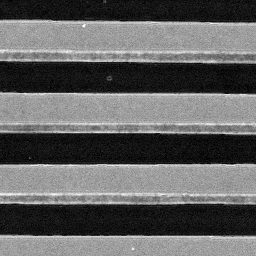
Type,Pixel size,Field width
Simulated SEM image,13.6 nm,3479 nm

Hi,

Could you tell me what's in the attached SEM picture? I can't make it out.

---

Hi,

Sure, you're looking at lines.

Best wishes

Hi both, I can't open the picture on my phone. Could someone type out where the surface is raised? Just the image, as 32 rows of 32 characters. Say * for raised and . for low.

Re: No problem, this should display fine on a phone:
................................
................................
................................
********************************
********************************
********************************
********************************
********************************
................................
................................
................................
................................
********************************
********************************
********************************
********************************
......**************************
................................
................................
................................
................................
********************************
********************************
********************************
********************************
................................
................................
................................
................................
................................
********************************
********************************